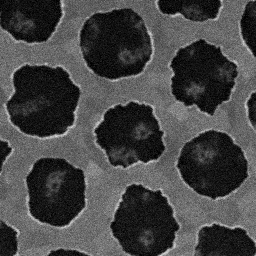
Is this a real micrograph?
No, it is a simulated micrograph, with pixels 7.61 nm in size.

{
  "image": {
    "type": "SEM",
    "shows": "holes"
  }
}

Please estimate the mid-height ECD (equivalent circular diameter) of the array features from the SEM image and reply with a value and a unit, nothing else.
518 nm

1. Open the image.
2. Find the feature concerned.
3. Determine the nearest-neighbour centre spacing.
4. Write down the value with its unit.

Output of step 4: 686 nanometers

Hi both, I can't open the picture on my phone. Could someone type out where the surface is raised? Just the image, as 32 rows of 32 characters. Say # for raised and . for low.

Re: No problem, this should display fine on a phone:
........############........###.
........#####....###.......###..
........###.......######..####..
.......###........############..
#.....####.........###########..
##########.........#####..#####.
##########.........###......###.
###########........##........###
##......###.......###.........##
##.......###.....#####........##
##.......############........###
##........###########........###
#.........############......###.
#.........####.....######..####.
#........####......############.
##.......###........###########.
###.....####........#####...####
############........####.....###
.############........##.......##
.############.......##.........#
####.....#####...#####.........#
####......############.........#
###........############........#
###........#####..######......##
###........####......####...####
####.......####......###########
####......####........##########
#####....#####........##########
..############........###.....##
..############........###......#
..#############.......###.......
..####....######.....###........